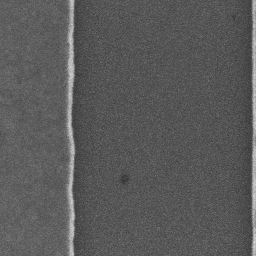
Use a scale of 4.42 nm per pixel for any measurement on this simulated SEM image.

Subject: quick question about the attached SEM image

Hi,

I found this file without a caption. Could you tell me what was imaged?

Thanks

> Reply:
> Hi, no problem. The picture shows one or a few lines or trenches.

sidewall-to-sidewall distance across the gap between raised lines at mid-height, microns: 0.798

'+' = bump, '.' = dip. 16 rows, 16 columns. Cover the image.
+++++...........
+++++...........
+++++...........
+++++...........
+++++...........
++++............
++++............
++++............
+++++...........
+++++...........
+++++...........
++++............
+++++...........
+++++...........
++++............
++++............